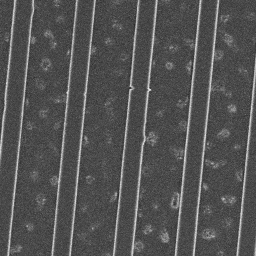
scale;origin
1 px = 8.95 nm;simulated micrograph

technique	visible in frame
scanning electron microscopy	parallel lines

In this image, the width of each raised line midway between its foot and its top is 165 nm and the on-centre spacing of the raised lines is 550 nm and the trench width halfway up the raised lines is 0.383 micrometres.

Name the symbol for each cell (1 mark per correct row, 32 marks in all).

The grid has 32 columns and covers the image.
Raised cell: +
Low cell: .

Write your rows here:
..++......++.....+++.....++.....
..++.....+++.....+++.....++.....
..++.....+++.....++......++.....
..++.....+++.....++......++.....
.+++.....++......++......++.....
.+++.....++......++......++.....
.+++.....++......++.....+++.....
.++......++......++.....+++.....
.++......++......++.....+++.....
.++......++.....+++.....++......
.++......++.....+++.....++......
.++.....+++.....+++.....++......
.++.....+++.....++......++......
.++.....+++.....++......++.....+
+++.....++......++......++.....+
+++.....++......++......++.....+
+++.....++......++.....+++.....+
++......++......++.....+++.....+
++......++.....+++.....+++.....+
++......++.....+++.....++......+
++......++.....+++.....++......+
++.....+++.....+++.....++......+
++.....+++.....++......++......+
++.....+++.....++......++.....++
++.....++......++......++.....++
++.....++......++......++.....++
++.....++......++.....+++.....++
+......++......++.....+++.....++
+......++.....+++.....+++.....++
+......++.....+++.....++......++
+......++.....+++.....++......++
+......++.....+++.....++......++